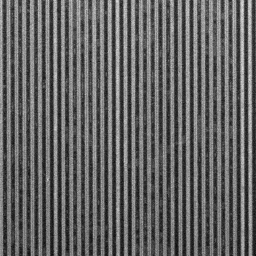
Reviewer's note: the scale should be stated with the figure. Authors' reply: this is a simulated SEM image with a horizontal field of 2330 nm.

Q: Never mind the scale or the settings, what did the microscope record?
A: parallel lines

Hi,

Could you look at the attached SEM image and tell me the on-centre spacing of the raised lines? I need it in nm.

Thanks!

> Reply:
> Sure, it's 70.9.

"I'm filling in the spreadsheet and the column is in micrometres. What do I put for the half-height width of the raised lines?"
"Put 0.0239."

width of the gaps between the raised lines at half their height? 41 nm